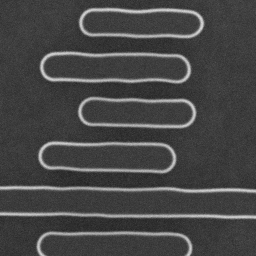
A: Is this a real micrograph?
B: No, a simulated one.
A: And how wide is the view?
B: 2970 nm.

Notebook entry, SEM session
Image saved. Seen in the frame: groups of lines, slits or small figures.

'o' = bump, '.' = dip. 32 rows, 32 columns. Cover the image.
................................
...........ooooooooooooo........
..........ooooooooooooooo.......
..........ooooooooooooooo.......
......................oo........
................................
................................
.....oooooooooooooooooo.........
.....ooooooooooooooooooo........
......ooooooooooooooooo.........
................................
................................
...........ooo..o...............
..........oooooooooooooo........
..........oooooooooooooo........
...........ooooooooooooo........
................................
................................
.....oooooooooooooooo...........
.....ooooooooooooooooo..........
.....ooooooooooooooooo..........
................................
................................
ooooooo..oo.....................
oooooooooooooooooooooooooooooooo
oooooooooooooooooooooooooooooooo
oooooooooooooooooooooooooooooooo
................................
................................
.....oooooooooooooooooo.........
.....ooooooooooooooooooo........
.....ooooooooooooooooooo........